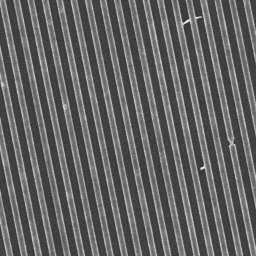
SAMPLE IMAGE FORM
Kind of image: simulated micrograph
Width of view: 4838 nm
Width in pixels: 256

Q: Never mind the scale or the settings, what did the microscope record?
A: parallel lines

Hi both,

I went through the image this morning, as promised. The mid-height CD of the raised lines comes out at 107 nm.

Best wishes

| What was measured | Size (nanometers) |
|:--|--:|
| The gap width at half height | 158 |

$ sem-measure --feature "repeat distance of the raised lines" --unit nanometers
266